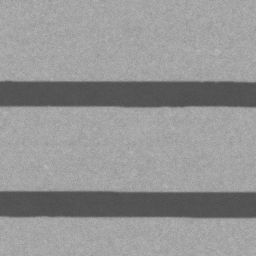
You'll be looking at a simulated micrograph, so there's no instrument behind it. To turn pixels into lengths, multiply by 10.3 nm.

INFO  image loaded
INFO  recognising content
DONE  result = lines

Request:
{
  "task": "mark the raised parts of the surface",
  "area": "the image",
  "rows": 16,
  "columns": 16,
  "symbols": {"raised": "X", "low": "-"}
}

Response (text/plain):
XXXXXXXXXXXXXXXX
XXXXXXXXXXXXXXXX
XXXXXXXXXXXXXXXX
XXXXXXXXXXXXXXXX
XXXXXXXXXXXXXXXX
----------------
----------------
XXXXXXXXXXXXXXXX
XXXXXXXXXXXXXXXX
XXXXXXXXXXXXXXXX
XXXXXXXXXXXXXXXX
XXXXXXXXXXXXXXXX
----------------
----------------
XXXXXXXXXXXXXXXX
XXXXXXXXXXXXXXXX